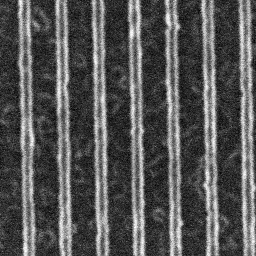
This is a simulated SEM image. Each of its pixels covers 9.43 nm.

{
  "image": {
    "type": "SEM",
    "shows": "parallel lines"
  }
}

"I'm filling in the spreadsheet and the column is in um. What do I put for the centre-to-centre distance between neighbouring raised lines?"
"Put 0.346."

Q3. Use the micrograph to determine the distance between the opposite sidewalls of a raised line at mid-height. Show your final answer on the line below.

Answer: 0.0848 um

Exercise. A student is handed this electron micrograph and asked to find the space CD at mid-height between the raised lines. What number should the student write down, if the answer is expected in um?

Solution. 0.263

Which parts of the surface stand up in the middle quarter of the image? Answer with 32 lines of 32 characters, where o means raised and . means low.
o.......oo.......oo.......oo....
o.......oo.......oo.......oo....
o.......oo.......oo.......oo....
o.......oo.......oo.......oo....
o.......oo.......oo.......oo....
........oo.......oo.......oo....
........oo.......oo.......oo....
........oo.......oo.......oo....
o.......oo.......oo.......oo....
o.......oo.......oo.......oo....
o.......oo.......oo.......oo....
o.......oo.......oo.......oo....
o.......oo.......oo.......oo....
o.......oo.......oo.......oo....
o.......oo.......oo.......oo....
o.......oo.......oo.......ooo...
o.......oo.......ooo......ooo...
o.......oo.......oo.......oo....
o.......oo.......oo.......ooo...
o.......oo.......oo.......ooo...
o.......oo.......oo.......ooo...
o.......oo.......oo.......ooo...
o.......oo.......oo........oo...
o.......oo.......oo........o....
o.......oo.......oo........oo...
o.......oo.......ooo.......oo...
o.......oo.......ooo.......oo...
o.......oo.......ooo.......oo...
o.......oo.......ooo.......oo...
o.......oo.......ooo.......oo...
o.......oo.......ooo.......oo...
o.......oo.......oo........oo...